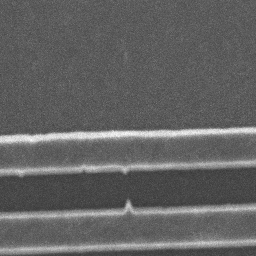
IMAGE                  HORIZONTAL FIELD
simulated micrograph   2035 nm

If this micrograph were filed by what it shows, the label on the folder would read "one or a few lines or trenches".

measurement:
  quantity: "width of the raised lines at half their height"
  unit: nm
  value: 290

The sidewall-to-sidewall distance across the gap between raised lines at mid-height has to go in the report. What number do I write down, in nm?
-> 332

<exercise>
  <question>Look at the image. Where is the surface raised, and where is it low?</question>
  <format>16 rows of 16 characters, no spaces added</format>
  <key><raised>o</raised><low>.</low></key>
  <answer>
................
................
................
................
................
................
................
................
...ooooooooooooo
oooooooooooooooo
ooooooooo.......
................
................
oooooooooooooooo
oooooooooooooooo
ooooooo.........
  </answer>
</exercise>